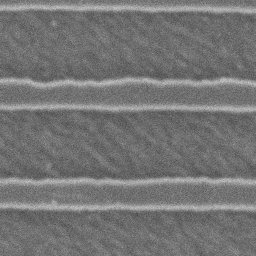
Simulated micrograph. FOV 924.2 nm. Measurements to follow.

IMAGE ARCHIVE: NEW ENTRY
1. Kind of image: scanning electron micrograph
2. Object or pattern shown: lines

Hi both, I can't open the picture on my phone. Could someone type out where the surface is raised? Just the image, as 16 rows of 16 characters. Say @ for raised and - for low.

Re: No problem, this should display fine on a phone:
@@@@@@@@@@@@@@@@
----------------
----------------
----------------
----------------
@@@@@@@@@@@@@@@@
@@@@@@@@@@@@@@@@
----------------
----------------
----------------
----------------
@@@@@@@@@@@@@@@@
@@@@@@@@@@@@@@@@
----------------
----------------
----------------